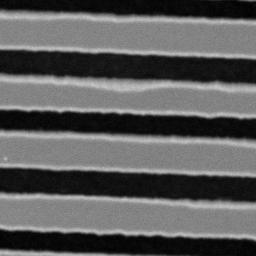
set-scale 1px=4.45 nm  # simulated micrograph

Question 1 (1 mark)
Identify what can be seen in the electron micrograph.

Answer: lines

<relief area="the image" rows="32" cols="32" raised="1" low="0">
00000000000000000000000000000000
10000000000000000000000000000000
11111111111111111111111111111110
11111111111111111111111111111111
11111111111111111111111111111111
11111111111111111111111111111111
00000000011111111111111111111111
00000000000000000000000000000000
00000000000000000000000000000000
10000000000000000000000000000000
11111111111111111111111111110000
11111111111111111111111111111111
11111111111111111111111111111111
11111111111111111111111111111111
00000000000000000000000011111111
00000000000000000000000000000000
11110000000000000000000000000000
11111111111111111111111111111110
11111111111111111111111111111111
11111111111111111111111111111111
11111111111111111111111111111111
00000000000000011111111111111111
00000000000000000000000000000000
00000000000000000000000000000000
11111111101000000000000000000000
11111111111111111111111111111111
11111111111111111111111111111111
11111111111111111111111111111111
11111111111111111111111111111111
00000000000000000011111111111111
00000000000000000000000000000000
11111100000000000000000000000000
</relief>